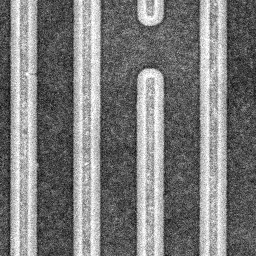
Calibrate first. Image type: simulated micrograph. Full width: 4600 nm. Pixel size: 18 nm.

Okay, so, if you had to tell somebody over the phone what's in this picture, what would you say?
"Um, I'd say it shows parallel lines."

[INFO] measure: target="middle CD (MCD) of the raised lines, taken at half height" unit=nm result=321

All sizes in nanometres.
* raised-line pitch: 1140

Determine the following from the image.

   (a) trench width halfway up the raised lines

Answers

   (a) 804 nm